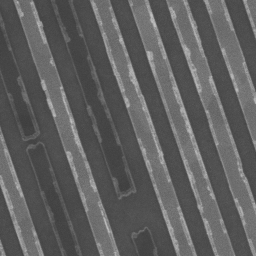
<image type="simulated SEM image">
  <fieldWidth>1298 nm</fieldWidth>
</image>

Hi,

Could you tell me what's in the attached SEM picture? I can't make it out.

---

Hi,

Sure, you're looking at parallel lines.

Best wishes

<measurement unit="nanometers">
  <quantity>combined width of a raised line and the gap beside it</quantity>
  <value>183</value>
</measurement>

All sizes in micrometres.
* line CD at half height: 0.0942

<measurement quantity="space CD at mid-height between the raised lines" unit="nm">89.4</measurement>